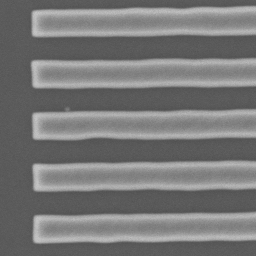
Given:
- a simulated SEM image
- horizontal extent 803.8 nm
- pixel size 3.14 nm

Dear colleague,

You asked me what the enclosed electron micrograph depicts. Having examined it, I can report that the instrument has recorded groups of lines, slits or small figures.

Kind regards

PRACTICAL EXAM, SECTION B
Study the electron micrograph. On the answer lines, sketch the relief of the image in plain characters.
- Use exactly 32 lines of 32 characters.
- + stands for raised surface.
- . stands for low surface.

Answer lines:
................................
.....+++++++++++++++++++++++++++
....++++++++++++++++++++++++++++
....++++++++++++++++++++++++++++
................................
................................
................................
................................
....++++++++++++++++++++++++++++
....++++++++++++++++++++++++++++
....+++++++++++++++++++++++++++.
................................
................................
................................
.....+++++++++++++++++++++++++++
....++++++++++++++++++++++++++++
....++++++++++++++++++++++++++++
................................
................................
................................
.................+...+++++++++++
....++++++++++++++++++++++++++++
....++++++++++++++++++++++++++++
.....+++++++++++++..++++++......
................................
................................
................................
....++++++++++++++++++++++++++++
....++++++++++++++++++++++++++++
....++++++++++++++++++++++++++++
................................
................................